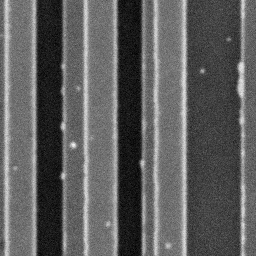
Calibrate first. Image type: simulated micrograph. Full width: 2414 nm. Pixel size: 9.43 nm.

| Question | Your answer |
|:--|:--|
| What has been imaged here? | lines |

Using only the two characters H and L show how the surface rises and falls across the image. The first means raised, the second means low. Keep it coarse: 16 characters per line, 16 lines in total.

HHLLHHHLLHHHLLLH
HHLLHHHLLHHHLLLH
HHLLHHHLLHHHLLLH
HHLLHHHLLHHHLLLH
HHLLHHHLLHHHLLLH
HHLLHHHLLHHHLLLH
HHLLHHHLLHHHLLLH
HHLLHHHLLHHHLLLH
HHLLHHHLLHHHLLLH
HHLLHHHLLHHHLLLH
HHLLHHHLLHHHLLLH
HHLLHHHLLHHHLLLH
HHLLHHHLLHHHLLLH
HHLLHHHLLHHHLLLH
HHLLHHHLLHHHLLLH
HHLLHHHLLHHHLLLH